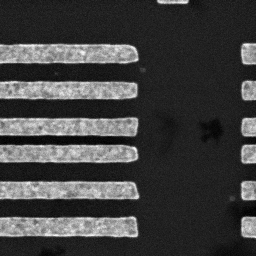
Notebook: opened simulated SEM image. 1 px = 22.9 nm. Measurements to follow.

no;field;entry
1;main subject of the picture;wiring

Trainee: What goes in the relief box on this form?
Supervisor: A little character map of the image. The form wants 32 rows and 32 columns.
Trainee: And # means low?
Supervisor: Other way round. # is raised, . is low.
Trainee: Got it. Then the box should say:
................................
................................
................................
................................
................................
................................
#################.............##
#################.............##
................................
................................
#################..............#
#################.............##
................................
................................
................................
#################.............##
#################.............##
................................
#################.............##
#################.............##
................................
................................
................................
#################.............##
#################.............##
................................
................................
#################.............##
#################.............##
..............###..............#
................................
................................